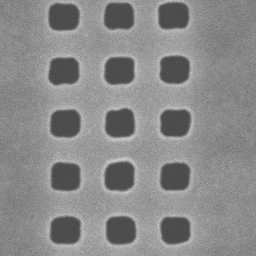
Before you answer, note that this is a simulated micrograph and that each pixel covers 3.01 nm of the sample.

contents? a regular array of holes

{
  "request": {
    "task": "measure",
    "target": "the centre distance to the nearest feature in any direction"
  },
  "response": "161 nm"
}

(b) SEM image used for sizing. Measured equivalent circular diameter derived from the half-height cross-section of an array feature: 93.7 nm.